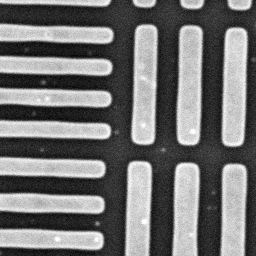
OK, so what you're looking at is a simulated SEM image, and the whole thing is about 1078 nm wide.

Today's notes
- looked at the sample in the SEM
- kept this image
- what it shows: groups of lines, slits or small figures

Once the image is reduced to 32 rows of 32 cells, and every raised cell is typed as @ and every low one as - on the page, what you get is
---------@@@@----@@----@@----@@-
--------------------------------
--------------------------------
@@@@@@@@@@@@-----@@----@@-------
@@@@@@@@@@@@@@---@@@---@@---@@@-
-----------------@@@---@@---@@@-
-----------------@@@---@@---@@@-
@@@@@@@@@@@@@----@@@---@@---@@@-
@@@@@@@@@@@@@@---@@----@@---@@@-
-----------------@@---@@@---@@@-
-----------------@@---@@@---@@@-
@@@@@@@@@@@@@----@@---@@@---@@@-
@@@@@@@@@@@@@@---@@---@@@---@@@-
-----------------@@---@@@---@@@-
-----------------@@---@@@---@@@-
@@@@@@@@@@-------@@---@@@---@@--
@@@@@@@@@@@@@@---@@---@@@---@@--
-----------------@@---@@@---@@--
--------------------------------
--------------------------------
@@@@@@@@@@@@@---@@--------------
@@@@@@@@@@@@@---@@@---@@@---@@@-
----------------@@@---@@@---@@@-
----------------@@@---@@@---@@@-
@@@@@@@---------@@@---@@@---@@@-
@@@@@@@@@@@@@---@@@---@@@---@@@-
----------@@----@@@---@@@---@@@-
----------------@@@---@@@---@@@-
----------------@@@---@@@---@@@-
@@@@@@@@@@@@@---@@@---@@@---@@--
@@@@@@@@@@@@@---@@@---@@@---@@--
----------------@@----@@@---@@--